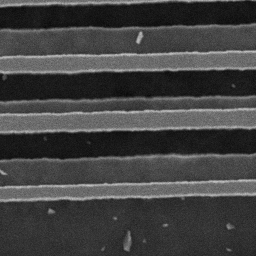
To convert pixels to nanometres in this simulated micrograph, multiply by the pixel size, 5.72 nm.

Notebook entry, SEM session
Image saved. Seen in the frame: lines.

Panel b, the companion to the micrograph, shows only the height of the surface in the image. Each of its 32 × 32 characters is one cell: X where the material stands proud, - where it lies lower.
XXXXXXXXXXX---------------------
--------------------------------
--------------------------------
--------XXXXX--XXXXXXXXXXXXXXXXX
XXXXXXXXXXXXXXXXXXXXXXXXXXXXXXXX
XXXXXXXXXXXXXXXXXXXXXXXXXXXXXXXX
XXXXXXXXXXXXXXXXXXXXXXXXXXXXXXXX
XXXXXXXXXXXXXXXXXXXXXXXXXXXXXXXX
XXXXXXXXXXXXXXXXXXXXXXXXXXXXXXXX
--------------------------------
--------------------------------
--------------------------------
-------------XXXXXXXXXXXXXXXXXXX
XXXXXXXXXXXXXXXXXXXXXXXXXXXXXXXX
XXXXXXXXXXXXXXXXXXXXXXXXXXXXXXXX
XXXXXXXXXXXXXXXXXXXXXXXXXXXXXXXX
XXXXX---------------------------
--------------------------------
--------------------------------
------------------XXXXXXXXXXXXXX
XXXXXXXXXXXXXXXXXXXXXXXXXXXXXXXX
XXXXXXXXXXXXXXXXXXXXXXXXXXXXXXXX
XXXXXXXXXXXXXXXXXXXXXXXXXXXXXXXX
XXXXXXXXXXXXXXXXXXXXXXXXXXXXXXXX
XXXXXXXXXXXXXXXXXXXXXX----------
--------------------------------
--------------------------------
--------------------------------
--------------------------------
--------------------------------
--------------------------------
--------------------------------